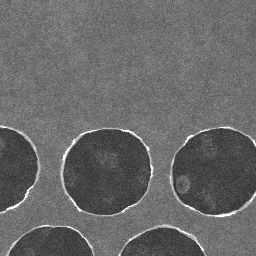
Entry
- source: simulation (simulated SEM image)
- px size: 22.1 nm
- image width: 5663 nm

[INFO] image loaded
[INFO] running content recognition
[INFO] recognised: holes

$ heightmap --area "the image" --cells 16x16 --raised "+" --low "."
++++++++++++++++
++++++++++++++++
++++++++++++++++
++++++++++++++++
++++++++++++++++
++++++++++++++++
++++++++++++++++
++++++++++++++++
.++++...++++...+
..++.....++.....
..++.....++.....
..++.....++.....
.++++....++.....
++++++++++++++++
++...++++..+++++
+.....++.....+++